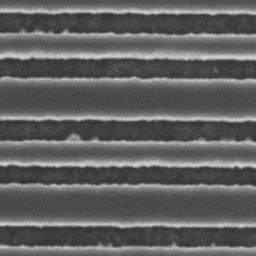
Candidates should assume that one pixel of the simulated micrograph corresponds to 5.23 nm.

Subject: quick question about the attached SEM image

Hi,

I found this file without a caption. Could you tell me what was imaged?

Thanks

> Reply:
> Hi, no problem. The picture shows lines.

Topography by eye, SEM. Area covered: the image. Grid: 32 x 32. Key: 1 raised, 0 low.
11111111111111111111111111111111
11111111111111111111111111111111
00000000000000000000000000000000
00000000000000000000000000000000
11111111111111111111111111111111
11111111111111111111111111111111
11111111111111111111111111111111
00000000000000000000000000000000
00000000000000000000000000000000
00000000000000000000000000000000
11111111111111111111111111111111
11111111111111111111111111111111
11111111111111111111111111111111
11111111111111111111111111111111
11111111111111111111111111111111
00000000000000000000000000000000
00000000000000000000000000000000
00000000000000000000000000000000
11111111111111111111111111111111
11111111111111111111111111111111
10111111111111111111111111111111
00000000000000000000000000000000
00000000000000000000000000000000
11111111111111111111111111111111
11111111111111111111111111111111
11111111111111111111111111111111
11111111111111111111111111111111
11111111111111111111111111111111
00000000000000000000000000000000
00000000000000000000000000000000
00000000000000000000000000000000
11111111111111111111111111111111